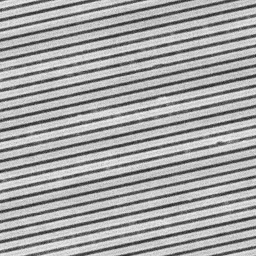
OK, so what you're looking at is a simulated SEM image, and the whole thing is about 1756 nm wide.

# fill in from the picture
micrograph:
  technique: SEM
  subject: parallel lines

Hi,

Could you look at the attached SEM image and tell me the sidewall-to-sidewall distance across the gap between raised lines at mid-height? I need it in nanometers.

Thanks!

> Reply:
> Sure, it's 30.2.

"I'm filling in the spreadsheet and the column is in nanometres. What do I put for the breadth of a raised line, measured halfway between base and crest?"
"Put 41.9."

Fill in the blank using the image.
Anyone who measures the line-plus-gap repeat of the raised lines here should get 0.0676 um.